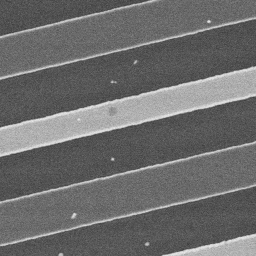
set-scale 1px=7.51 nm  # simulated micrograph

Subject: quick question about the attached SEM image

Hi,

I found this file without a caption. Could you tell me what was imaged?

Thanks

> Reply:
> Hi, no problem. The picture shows lines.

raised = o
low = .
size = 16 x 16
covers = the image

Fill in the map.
.......ooooooooo
...oooooooooooo.
oooooooooo......
oooooo..........
oo..............
................
................
................
................
.............ooo
.........ooooooo
.....ooooooooooo
.ooooooooooo....
oooooooo........
oooo............
................